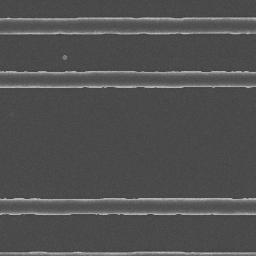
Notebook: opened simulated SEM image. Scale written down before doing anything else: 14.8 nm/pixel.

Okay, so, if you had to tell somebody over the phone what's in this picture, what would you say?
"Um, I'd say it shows lines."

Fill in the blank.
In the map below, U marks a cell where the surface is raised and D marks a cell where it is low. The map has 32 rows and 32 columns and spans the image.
DDDDDDDDDDDDDDDDDDDDDDDDDDDDDDDD
DDDDDDDDDDDDDDDDDDDDDDDDDDDDDDDD
UUUUUUUUUUUUUUUUUUUUUUUUUUUUUUUU
UUUUUUUUUUUUUUUUUUUUUUUUUUUUUUUU
DDDDDDDDDDDDDDDDDDDDDDDDDDDDDDDD
DDDDDDDDDDDDDDDDDDDDDDDDDDDDDDDD
DDDDDDDDDDDDDDDDDDDDDDDDDDDDDDDD
DDDDDDDDDDDDDDDDDDDDDDDDDDDDDDDD
DDDDDDDDDDDDDDDDDDDDDDDDDDDDDDDD
UUUUUUUUUUUUUUUUUUUUUUUUUUUUUUUU
UUUUUUUUUUUUUUUUUUUUUUUUUUUUUUUU
DDDDDDDDDDDDDDDDDDDDDDDDDDDDDDDD
DDDDDDDDDDDDDDDDDDDDDDDDDDDDDDDD
DDDDDDDDDDDDDDDDDDDDDDDDDDDDDDDD
DDDDDDDDDDDDDDDDDDDDDDDDDDDDDDDD
DDDDDDDDDDDDDDDDDDDDDDDDDDDDDDDD
DDDDDDDDDDDDDDDDDDDDDDDDDDDDDDDD
DDDDDDDDDDDDDDDDDDDDDDDDDDDDDDDD
DDDDDDDDDDDDDDDDDDDDDDDDDDDDDDDD
DDDDDDDDDDDDDDDDDDDDDDDDDDDDDDDD
DDDDDDDDDDDDDDDDDDDDDDDDDDDDDDDD
DDDDDDDDDDDDDDDDDDDDDDDDDDDDDDDD
DDDDDDDDDDDDDDDDDDDDDDDDDDDDDDDD
DDDDDDDDDDDDDDDDDDDDDDDDDDDDDDDD
DDDDDDDDDDDDDDDDDDDDDDDDDDDDDDDD
UUUUUUUUUUUUUUUUUUUUUUUUUUUUUUUU
UUUUUUUUUUUUUUUUUUUUUUUUUUUUUUUU
DDDDDDDDDDDDDDDDDDDDDDDDDDDDDDDD
DDDDDDDDDDDDDDDDDDDDDDDDDDDDDDDD
DDDDDDDDDDDDDDDDDDDDDDDDDDDDDDDD
DDDDDDDDDDDDDDDDDDDDDDDDDDDDDDDD
DDDDDDDDDDDDDDDDDDDDDDDDDDDDDDDD